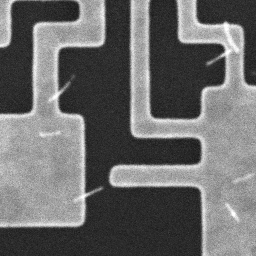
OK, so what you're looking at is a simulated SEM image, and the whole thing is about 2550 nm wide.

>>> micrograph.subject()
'wiring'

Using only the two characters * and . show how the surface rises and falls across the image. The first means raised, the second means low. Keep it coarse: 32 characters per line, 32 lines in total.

*.........***...***...**........
*.........***...**....**........
*.........***...***...***.......
*...*********...***...********..
*...*********...***...********..
*...*********...***.........**..
....***.........***.........**..
....***.........***.........**..
....***.........***.........**..
....***.........***.........**..
....***.........***.........***.
....***.........***......*******
....***.........***......*******
....***.........***......*******
**********......***......*******
**********......****************
**********......****************
**********...............*******
**********...............*******
**********...............*******
**********...............*******
**********....******************
**********....******************
**********...............*******
***********..............*******
***********..............*******
***********..............*******
**********...............*******
.........................*******
.........................*******
.........................*******
.........................*******